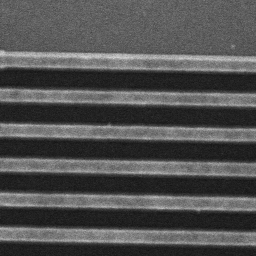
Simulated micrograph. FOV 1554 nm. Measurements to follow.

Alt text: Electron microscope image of parallel lines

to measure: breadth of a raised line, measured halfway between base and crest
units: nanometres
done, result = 92.5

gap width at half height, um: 0.121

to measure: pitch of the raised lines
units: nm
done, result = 210